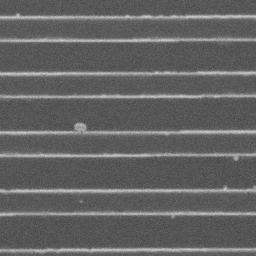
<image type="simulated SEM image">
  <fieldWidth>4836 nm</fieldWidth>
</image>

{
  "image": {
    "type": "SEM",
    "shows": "lines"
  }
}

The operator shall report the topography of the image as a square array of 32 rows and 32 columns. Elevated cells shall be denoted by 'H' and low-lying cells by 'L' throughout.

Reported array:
LLLLLLLLLLLLLLLLLLLLLLLLLLLLLLLL
LLLLLLLLLLLLLLLLLLLLLLLLLLLLLLLL
HHHHHHHHHHHHHHHHHHHHHHHHHHHHHHHH
HHHHHHHHHHHHHHHHHHHHHHHHHHHHHHHH
HHHHHHHHHHHHHHHHHHHHHHHHHHHHHHHH
LLLLLLLLLLLLLLLLLLLLLLLLLLLLLLLL
LLLLLLLLLLLLLLLLLLLLLLLLLLLLLLLL
LLLLLLLLLLLLLLLLLLLLLLLLLLLLLLLL
LLLLLLLLLLLLLLLLLLLLLLLLLLLLLLLL
HHHHHHHHHHHHHHHHHHHHHHHHHHHHHHHH
HHHHHHHHHHHHHHHHHHHHHHHHHHHHHHHH
HHHHHHHHHHHHHHHHHHHHHHHHHHHHHHHH
LLLLLLLLLLLLLLLLLLLLLLLLLLLLLLLL
LLLLLLLLLLLLLLLLLLLLLLLLLLLLLLLL
LLLLLLLLLLLLLLLLLLLLLLLLLLLLLLLL
LLLLLLLLLLLLLLLLLLLLLLLLLLLLLLLL
LLLLLLLLLHHLLLLLLLLLLLLLLLLLLLLL
HHHHHHHHHHHHHHHHHHHHHHHHHHHHHHHH
HHHHHHHHHHHHHHHHHHHHHHHHHHHHHHHH
LLLLHHHHHHHHHHLLLLLLLLLLLLLLLLLL
LLLLLLLLLLLLLLLLLLLLLLLLLLLLLLLL
LLLLLLLLLLLLLLLLLLLLLLLLLLLLLLLL
LLLLLLLLLLLLLLLLLLLLLLLLLLLLLLLL
LLLLLLLLLLLLLLLLLLLLLLLLLLLLLLLL
HHHHHHHHHHHHHHHHHHHHHHHHHHHHHHHH
HHHHHHHHHHHHHHHHHHHHHHHHHHHHHHHH
HHHHHHHHHHHHHHHHHHHHHHHHHHHHHHHH
LLLLLLLLLLLLLLLLLLLLLLLLLLLLLLLL
LLLLLLLLLLLLLLLLLLLLLLLLLLLLLLLL
LLLLLLLLLLLLLLLLLLLLLLLLLLLLLLLL
LLLLLLLLLLLLLLLLLLLLLLLLLLLLLLLL
HHHHHHHHHHHHHHHHHHHHHHHHHHHHHHHH